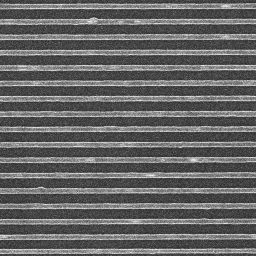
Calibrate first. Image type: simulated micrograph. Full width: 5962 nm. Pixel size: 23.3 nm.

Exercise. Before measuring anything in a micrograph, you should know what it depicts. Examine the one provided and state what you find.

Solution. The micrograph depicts parallel lines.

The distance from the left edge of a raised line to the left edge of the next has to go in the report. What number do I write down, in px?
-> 15.3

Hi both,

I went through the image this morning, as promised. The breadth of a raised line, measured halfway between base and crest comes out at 108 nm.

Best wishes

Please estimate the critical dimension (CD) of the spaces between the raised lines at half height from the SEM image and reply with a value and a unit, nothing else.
247 nm